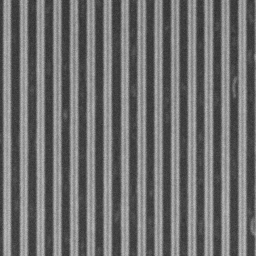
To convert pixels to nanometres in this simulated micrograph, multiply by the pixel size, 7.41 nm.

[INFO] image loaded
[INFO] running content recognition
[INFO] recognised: parallel lines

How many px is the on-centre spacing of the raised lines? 16.9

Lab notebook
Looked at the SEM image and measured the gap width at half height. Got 87.1 nm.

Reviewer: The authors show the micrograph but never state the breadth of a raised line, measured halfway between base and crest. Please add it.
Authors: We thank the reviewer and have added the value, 37.1 nanometers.